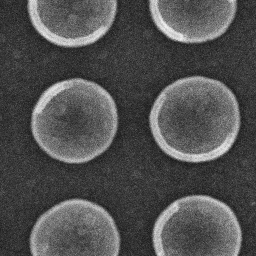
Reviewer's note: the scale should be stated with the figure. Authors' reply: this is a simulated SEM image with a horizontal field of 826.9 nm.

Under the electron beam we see raised bodies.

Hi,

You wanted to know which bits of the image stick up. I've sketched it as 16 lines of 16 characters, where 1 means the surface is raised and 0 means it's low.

0011111001111110
0011111000111100
0001110000010000
0000000000000000
0000000000000000
0001110000011100
0011111000111110
0011111001111110
0011111000111110
0001110000011100
0000000000000000
0000000000000000
0000000000011000
0001111000111110
0011111000111110
0011111000111110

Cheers